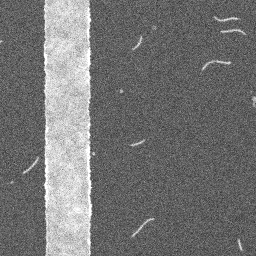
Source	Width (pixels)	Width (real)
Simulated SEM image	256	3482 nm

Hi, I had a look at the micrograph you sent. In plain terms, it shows one or a few lines or trenches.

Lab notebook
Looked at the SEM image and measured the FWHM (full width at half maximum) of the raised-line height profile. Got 597 nanometers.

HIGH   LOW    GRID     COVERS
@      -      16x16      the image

---@@@----------
---@@@----------
---@@@----------
---@@@----------
---@@@----------
---@@@----------
---@@@----------
---@@@----------
---@@@----------
---@@@----------
---@@@----------
---@@@----------
---@@@----------
---@@@----------
---@@@----------
---@@@----------